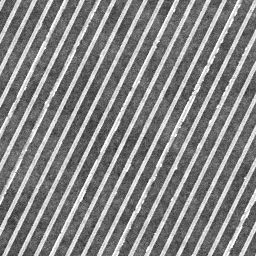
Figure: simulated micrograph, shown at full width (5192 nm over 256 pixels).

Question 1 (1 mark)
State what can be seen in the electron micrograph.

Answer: parallel lines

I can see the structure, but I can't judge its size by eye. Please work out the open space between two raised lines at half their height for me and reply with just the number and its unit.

232 nm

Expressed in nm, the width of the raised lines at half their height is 61.4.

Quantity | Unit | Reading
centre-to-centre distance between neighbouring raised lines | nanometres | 288